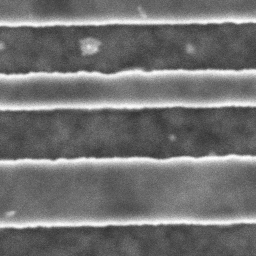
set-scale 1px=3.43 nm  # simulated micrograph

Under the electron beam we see lines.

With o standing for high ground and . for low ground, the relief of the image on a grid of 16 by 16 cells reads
oooooooooooooooo
ooooooo...o.....
................
................
........o.oooooo
oooooooooooooooo
oooooooooooooooo
................
................
................
oooooooooooooooo
oooooooooooooooo
oooooooooooooooo
oooooooooooooooo
................
................